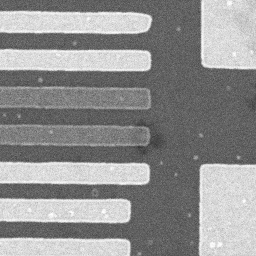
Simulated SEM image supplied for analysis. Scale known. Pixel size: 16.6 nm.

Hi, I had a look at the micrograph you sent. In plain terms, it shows wiring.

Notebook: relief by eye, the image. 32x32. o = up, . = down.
.........................ooooooo
.........................ooooooo
ooooooooooooooooooo......ooooooo
oooooooooooooooooo.......ooooooo
.........................ooooooo
.........................ooooooo
oooooooooooooooooo.......ooooooo
ooooooooooooooooooo......ooooooo
ooooooooooooooooooo............o
................................
................................
ooooooooooooooooooo.............
ooooooooooooooooooo.............
.................o..............
................................
................................
ooooooooooooooooooo.............
ooooooooooooooooooo.............
................................
................................
ooooooooooooo...................
ooooooooooooooooooo......ooooooo
oooooooooooooooooo.......ooooooo
.........................ooooooo
.........................ooooooo
oooooooooooooooo.........ooooooo
oooooooooooooooo.........ooooooo
.ooooooooooooooo.........ooooooo
.........................ooooooo
.........................ooooooo
oooooooooooooooo.........ooooooo
oooooooooooooooo.........ooooooo